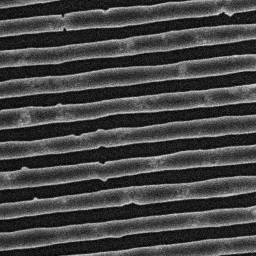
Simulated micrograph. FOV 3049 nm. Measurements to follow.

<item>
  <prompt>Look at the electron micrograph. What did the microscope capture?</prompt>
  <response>parallel lines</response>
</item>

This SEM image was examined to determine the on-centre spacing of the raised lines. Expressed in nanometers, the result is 358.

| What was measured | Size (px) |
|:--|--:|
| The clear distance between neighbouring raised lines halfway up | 13.2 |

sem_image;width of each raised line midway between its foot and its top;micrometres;0.201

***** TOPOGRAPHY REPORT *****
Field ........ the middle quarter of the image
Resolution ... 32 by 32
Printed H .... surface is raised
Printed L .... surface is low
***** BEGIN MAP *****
LLLLLLLLLLLLLLLLLLLLLHLHHHHHHHHH
LLLLLLLLLHHHHHHHHHHHHHHHHHHHHHHH
LLLLLHHHHHHHHHHHHHHHHHHHHHHHHHHH
HHHHHHHHHHHHHHHHHHHHHHHHHHHHHHHL
HHHHHHHHHHHHHHHHHHHHHHLLLLLLLLLL
HHHHHHHHHHHHLLHLLLLLLLLLLLLLLLLL
HHHHLLLLLLLLLLLLLLLLLLLLLLLLLLLL
LLLLLLLLLLLLLLLLLLLLLLLLHHHHHHHH
LLLLLLLLLLLLLLLHHHHHHHHHHHHHHHHH
LLLLLLLLLHHHHHHHHHHHHHHHHHHHHHHH
HHHHHHHHHHHHHHHHHHHHHHHHHHHHHHHH
HHHHHHHHHHHHHHHHHHHHHHHHHHHLLLLL
HHHHHHHHHHHHHLLLLLLLLLLLLLLLLLLL
HHHHHHHHLLLLLLLLLLLLLLLLLLLLLLLL
LLLLLLLLLLLLLLLLLLLLLLLLLLLLLHHH
LLLLLLLLLLLLLLLLLLLLLLHHHHHHHHHH
LLLLLLLLLHLHHHHHHHHHHHHHHHHHHHHH
LLLLLHHHHHHHHHHHHHHHHHHHHHHHHHHH
HHHHHHHHHHHHHHHHHHHHHHHHHHHHHHLL
HHHHHHHHHHHHHHHHHHHHHLLLLLLLLLLL
HHHHHHHHHHHHHLLLLLLLLLLLLLLLLLLL
HHHHHLLLLLLLLLLLLLLLLLLLLLLLLLLL
LLLLLLLLLLLLLLLLLLLLLLLLLLLHHHHH
LLLLLLLLLLLLLLLLLLHHHHHHHHHHHHHH
LLLLLLLLLLLHHHHHHHHHHHHHHHHHHHHH
HHHHHHHHHHHHHHHHHHHHHHHHHHHHHHHH
HHHHHHHHHHHHHHHHHHHHHHHHHLLLLLLL
HHHHHHHHHHHHHHHHHHLLLLLLLLLLLLLL
HHHHHHHHHHHLLLLLLLLLLLLLLLLLLLLL
HLLLLLLLLLLLLLLLLLLLLLLLLLLLLLLL
LLLLLLLLLLLLLLLLLLLHHHHHHHHHHHHH
LLLLLLLLLLHHHHHHHHHHHHHHHHHHHHHH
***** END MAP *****